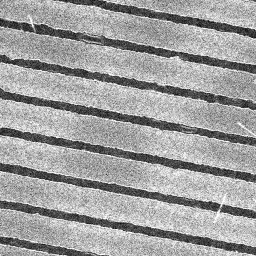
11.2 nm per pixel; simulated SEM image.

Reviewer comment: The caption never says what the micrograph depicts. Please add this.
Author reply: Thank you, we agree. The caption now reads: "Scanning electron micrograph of parallel lines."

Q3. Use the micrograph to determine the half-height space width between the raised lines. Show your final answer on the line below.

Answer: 0.0963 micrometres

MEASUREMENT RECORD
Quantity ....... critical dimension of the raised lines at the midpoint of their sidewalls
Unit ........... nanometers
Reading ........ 303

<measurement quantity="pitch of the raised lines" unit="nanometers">399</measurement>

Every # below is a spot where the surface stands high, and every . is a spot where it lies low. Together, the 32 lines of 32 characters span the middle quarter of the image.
################################
......##########################
...........#####################
####............################
#########.............##########
##############.............#####
###################.............
##########################......
###############################.
################################
.....#.#########################
...........#####################
###.............################
#########.............##########
##############........##...#####
####################.........###
########################.....###
################################
################################
.....###########################
..........######################
###............#################
#########............###########
##############............######
####################............
#########################.......
##############################..
################################
.#..############################
.........#######################
###............#################
#########...........############